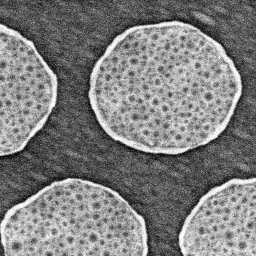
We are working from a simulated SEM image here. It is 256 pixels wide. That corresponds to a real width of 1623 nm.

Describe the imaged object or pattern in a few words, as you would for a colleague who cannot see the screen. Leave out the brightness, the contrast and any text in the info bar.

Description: raised bodies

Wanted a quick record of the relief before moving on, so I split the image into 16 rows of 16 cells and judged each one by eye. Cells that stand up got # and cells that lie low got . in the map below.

................
..........#.....
#......######...
##.....#######..
###...#########.
###...#########.
###...#########.
###...########..
##.....######...
#...............
................
...###........##
..######.....###
.########...####
#########..#####
#########..#####